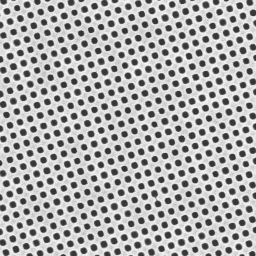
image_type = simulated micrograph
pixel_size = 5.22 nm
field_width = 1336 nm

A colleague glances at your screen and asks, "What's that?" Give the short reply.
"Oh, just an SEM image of a regular array of holes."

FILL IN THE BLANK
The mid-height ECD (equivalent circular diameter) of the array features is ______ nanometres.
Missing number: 35.8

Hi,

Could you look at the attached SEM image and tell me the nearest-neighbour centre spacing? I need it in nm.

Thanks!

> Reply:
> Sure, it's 54.8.